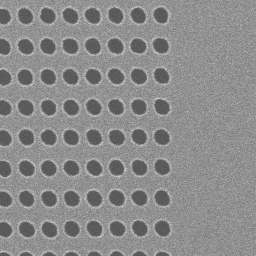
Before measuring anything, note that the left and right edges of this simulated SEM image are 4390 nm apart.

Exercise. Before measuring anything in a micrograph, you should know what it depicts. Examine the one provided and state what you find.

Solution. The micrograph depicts a regular array of holes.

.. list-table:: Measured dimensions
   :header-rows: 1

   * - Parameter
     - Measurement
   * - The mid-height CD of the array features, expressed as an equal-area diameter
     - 276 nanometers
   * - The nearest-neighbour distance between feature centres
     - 384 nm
